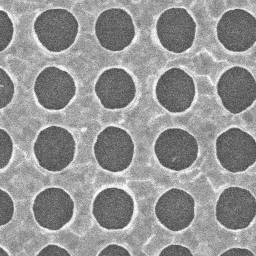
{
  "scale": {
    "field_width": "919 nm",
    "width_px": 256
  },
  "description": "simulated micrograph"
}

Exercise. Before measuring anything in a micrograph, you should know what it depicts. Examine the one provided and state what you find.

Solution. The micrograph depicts a regular array of holes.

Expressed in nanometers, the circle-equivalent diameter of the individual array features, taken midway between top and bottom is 155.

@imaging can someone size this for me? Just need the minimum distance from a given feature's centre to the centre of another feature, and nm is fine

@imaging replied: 210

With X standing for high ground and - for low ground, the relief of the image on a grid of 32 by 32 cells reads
XXXXXXXXXXXXXXXXXXXXXXXXXXXXXXXX
-XXXX----XXXX---XXXX----XXXX---X
-XXX------XX-----XXX----XXX-----
--XX------XX-----XX------XX-----
--XX------XX-----XXX----XXX-----
-XXXX----XXXX---XXXX----XXXX----
XXXXXX--XXXXXXXXXXXXXX-XXXXXX-XX
XXXXXXXXXXXXXXXXXXXXXXXXXXXXXXXX
XXXXXX--XXXXXXXXXXXXXXXXXXXX---X
-XXXX----XXX----XXXX----XXX-----
--XX-----XXX-----XX-----XXX-----
--XX------XX-----XX------XX-----
-XXXX----XXX-----XXX----XXX-----
XXXXX---XXXXX---XXXXX---XXXX---X
XXXXXXXXXXXXXXXXXXXXXXXXXXXXXXXX
XXXXXXXXXXXXXXXXXXXXXXXXXXXXXXXX
-XXXX----XXXX---XXXX---XXXXX---X
--XX-----XXX-----XXX----XXX-----
--XX-----XXX-----XX------XX-----
--XX-----XXX-----XX------XX-----
-XXXX----XXX----XXXX----XXX-----
XXXXXXXXXXXXXX-XXXXXXXXXXXXXX-XX
XXXXXXXXXXXXXXXXXXXXXXXXXXXXXXXX
XXXXXX-XXXXXX---XXXXXXXXXXXXX-XX
-XXX-----XXX-----XXX----XXX-----
--XX-----XXX-----XX-----XXX-----
--XX-----XX------XX-----XXX-----
-XXXX----XXX----XXXX----XXX-----
XXXXX---XXXXX---XXXXX--XXXXX---X
XXXXXXXXXXXXXXXXXXXXXXXXXXXXXXXX
XXXXXXXXXXXXXXXXXXXXXXXXXXXXXXXX
-XXXX----XXX----XXXX----XXXX---X